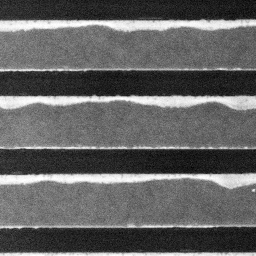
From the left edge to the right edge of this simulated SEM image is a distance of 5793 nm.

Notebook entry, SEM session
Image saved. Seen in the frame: lines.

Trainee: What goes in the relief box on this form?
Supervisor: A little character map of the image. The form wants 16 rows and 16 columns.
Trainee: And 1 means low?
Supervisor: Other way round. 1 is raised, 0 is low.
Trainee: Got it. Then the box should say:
0000000000000000
0111111111111111
1111111111111111
1111111111111111
0000000000000000
0000000000000000
1111111111111111
1111111111111111
1111111111111111
0000000000000000
0000000000000000
1111111111111111
1111111111111111
1111111111111111
0000000000000000
0000000000000000